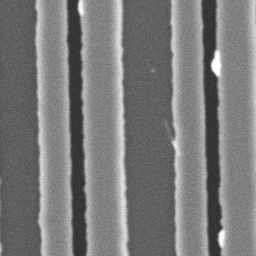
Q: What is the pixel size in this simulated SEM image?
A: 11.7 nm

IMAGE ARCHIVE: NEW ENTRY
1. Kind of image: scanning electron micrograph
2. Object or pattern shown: lines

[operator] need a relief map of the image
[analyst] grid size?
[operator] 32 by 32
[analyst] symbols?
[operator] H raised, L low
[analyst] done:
LLLLLHHHLLHHHHHLLLLLLLHHHLLHHHHH
LLLLLHHHLLHHHHHLLLLLLHHHHLLHHHHH
LLLLLHHHLLHHHHHLLLLLLHHHHLLHHHHH
LLLLLHHHLLHHHHHLLLLLLLHHHLLHHHHH
LLLLLHHHLLHHHHHLLLLLLLHHHLLHHHHH
LLLLLHHHLLHHHHHLLLLLLLHHHLLHHHHH
LLLLLHHHLLHHHHHLLLLLLLHHHLLHHHHH
LLLLLHHHLLHHHHHLLLLLLLHHHLLHHHHH
LLLLLHHHLLHHHHHLLLLLLLHHHLLHHHHH
LLLLLHHHLLHHHHHLLLLLLLHHHLLHHHHH
LLLLLHHHLLHHHHHLLLLLLLHHHLLHHHHH
LLLLLHHHLLHHHHHLLLLLLLHHHLLHHHHH
LLLLLHHHHLHHHHHLLLLLLLHHHLLHHHHH
LLLLLHHHHLHHHHHLLLLLLLHHHHLHHHHH
LLLLLHHHHLLHHHHLLLLLLLHHHHLHHHHH
LLLLLHHHHLLHHHHLLLLLLLHHHHLHHHHH
LLLLLHHHHLLHHHHLLLLLLLHHHHLHHHHH
LLLLLHHHHLLHHHHLLLLLLLHHHHLHHHHH
LLLLLHHHHLLHHHHLLLLLLLHHHHLHHHHH
LLLLLHHHHLLHHHHLLLLLLLHHHHLHHHHH
LLLLLHHHHLLHHHHLLLLLLLHHHHLHHHHH
LLLLLHHHHLLHHHHLLLLLLLHHHHLLHHHH
LLLLLHHHHLLHHHHLLLLLLLHHHHLLHHHH
LLLLLHHHHLLHHHHLLLLLLLHHHHLHHHHH
LLLLLHHHHLLHHHHLLLLLLLHHHHLHHHHH
LLLLLHHHHLLHHHHLLLLLLLHHHHLLHHHH
LLLLLHHHHLLHHHHLLLLLLLHHHHLLHHHH
LLLLLHHHHLLHHHHLLLLLLLHHHHLLHHHH
LLLLLHHHHLLHHHHHLLLLLLHHHHLLHHHH
LLLLLHHHHLLHHHHHLLLLLLHHHHLHHHHH
LLLLLHHHHLLHHHHHLLLLLLHHHHLHHHHH
LLLLLHHHHLLHHHHHLLLLLLHHHHLLHHHH